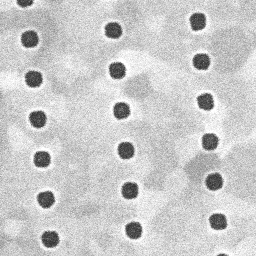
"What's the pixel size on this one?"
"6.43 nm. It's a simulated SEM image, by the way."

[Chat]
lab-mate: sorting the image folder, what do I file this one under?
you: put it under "a regular array of holes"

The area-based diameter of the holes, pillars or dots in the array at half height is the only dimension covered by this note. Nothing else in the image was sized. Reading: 125 nanometers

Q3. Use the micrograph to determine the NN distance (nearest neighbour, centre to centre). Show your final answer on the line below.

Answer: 258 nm